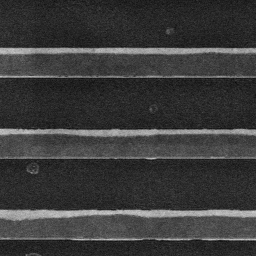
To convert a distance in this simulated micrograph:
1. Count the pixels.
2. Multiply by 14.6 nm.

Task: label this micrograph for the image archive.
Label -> lines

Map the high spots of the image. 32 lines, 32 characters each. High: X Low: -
--------------------------------
--------------------------------
--------------------------------
--------------------------------
--------------------------------
--------------------------------
XXXXXXXXXXXXXXXXXXXXXXXXXXXXXXXX
XXXXXXXXXXXXXXXXXXXXXXXXXXXXXXXX
XXXXXXXXXXXXXXXXXXXXXXXXXXXXXXXX
XXXXXXXXXXXXXXXXXXXXXXXXXXXXXXXX
--------------------------------
--------------------------------
--------------------------------
--------------------------------
--------------------------------
--------------------------------
-X----XX-----------------XX--XX-
XXXXXXXXXXXXXXXXXXXXXXXXXXXXXXXX
XXXXXXXXXXXXXXXXXXXXXXXXXXXXXXXX
XXXXXXXXXXXXXXXXXXXXXXXXXXXXXXXX
--------------------------------
--------------------------------
--------------------------------
--------------------------------
--------------------------------
--------------------------------
--------------------------------
XXXXXXXXXXXXXXXXXXXXXXXXXXXXXXXX
XXXXXXXXXXXXXXXXXXXXXXXXXXXXXXXX
XXXXXXXXXXXXXXXXXXXXXXXXXXXXXXXX
--------------------------------
--------------------------------